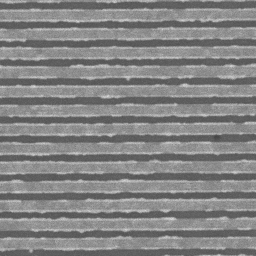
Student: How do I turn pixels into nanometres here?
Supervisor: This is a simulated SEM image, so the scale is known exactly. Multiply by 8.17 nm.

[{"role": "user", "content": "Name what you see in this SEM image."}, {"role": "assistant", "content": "parallel lines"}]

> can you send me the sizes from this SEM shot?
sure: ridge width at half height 12.1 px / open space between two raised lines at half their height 60.2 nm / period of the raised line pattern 155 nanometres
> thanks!